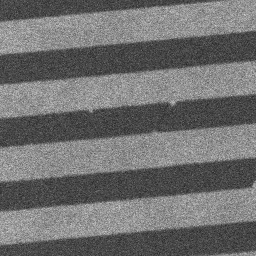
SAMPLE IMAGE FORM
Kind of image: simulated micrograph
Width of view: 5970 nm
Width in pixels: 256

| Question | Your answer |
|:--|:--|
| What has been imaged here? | one or a few lines or trenches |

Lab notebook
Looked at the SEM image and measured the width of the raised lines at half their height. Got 737 nm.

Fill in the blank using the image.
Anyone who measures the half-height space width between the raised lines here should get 726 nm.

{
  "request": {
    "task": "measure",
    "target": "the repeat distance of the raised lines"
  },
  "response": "1.46 um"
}